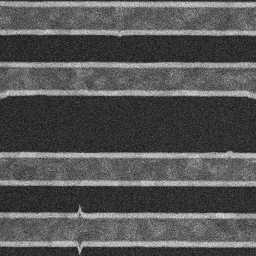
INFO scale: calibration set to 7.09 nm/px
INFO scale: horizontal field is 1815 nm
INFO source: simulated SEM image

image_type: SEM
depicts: one or a few lines or trenches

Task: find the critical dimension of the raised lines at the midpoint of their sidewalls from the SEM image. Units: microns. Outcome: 0.199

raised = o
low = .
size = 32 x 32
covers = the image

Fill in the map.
................................
oooooooooooooooooooooooooooooooo
oooooooooooooooooooooooooooooooo
oooooooooooooooooooooooooooooooo
................................
................................
................................
................................
oooooooooooooooooooooooooooooooo
oooooooooooooooooooooooooooooooo
oooooooooooooooooooooooooooooooo
ooooo.ooo...oooo.ooooooooooooooo
................................
................................
................................
................................
................................
................................
................................
ooooooooooooooooooooooooo...oo..
oooooooooooooooooooooooooooooooo
oooooooooooooooooooooooooooooooo
oooooooooooooooooooooooooooooooo
................................
................................
................................
................................
oooooooooooooooooooooooooooooooo
oooooooooooooooooooooooooooooooo
oooooooooooooooooooooooooooooooo
.........oo.......o......ooo.o.o
................................